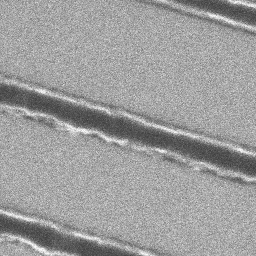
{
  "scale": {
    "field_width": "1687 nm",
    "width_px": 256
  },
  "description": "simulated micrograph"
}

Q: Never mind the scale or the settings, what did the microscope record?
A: one or a few lines or trenches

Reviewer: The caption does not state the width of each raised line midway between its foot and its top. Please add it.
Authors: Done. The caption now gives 175 nanometers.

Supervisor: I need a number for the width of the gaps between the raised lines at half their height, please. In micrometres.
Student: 0.659